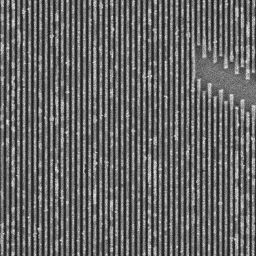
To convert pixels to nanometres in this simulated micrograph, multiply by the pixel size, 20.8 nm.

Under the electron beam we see parallel lines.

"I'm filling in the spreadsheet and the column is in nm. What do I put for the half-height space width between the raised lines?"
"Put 57.2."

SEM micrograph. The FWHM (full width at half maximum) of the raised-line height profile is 2.75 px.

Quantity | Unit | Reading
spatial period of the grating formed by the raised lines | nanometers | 114